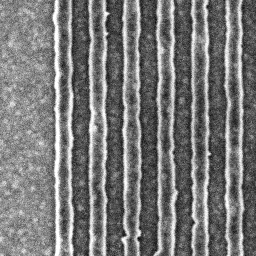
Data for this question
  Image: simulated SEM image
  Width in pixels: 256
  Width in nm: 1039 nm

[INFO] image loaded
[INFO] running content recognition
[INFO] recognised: parallel lines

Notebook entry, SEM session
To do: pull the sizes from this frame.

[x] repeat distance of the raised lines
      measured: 138 nm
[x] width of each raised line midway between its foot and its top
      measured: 15.2 pixels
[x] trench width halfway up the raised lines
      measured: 78.6 nm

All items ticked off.